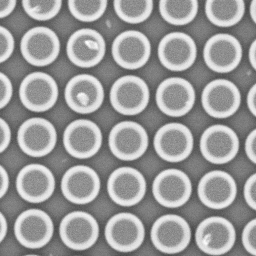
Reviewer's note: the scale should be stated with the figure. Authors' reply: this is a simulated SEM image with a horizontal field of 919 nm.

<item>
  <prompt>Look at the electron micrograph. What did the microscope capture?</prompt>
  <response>an array of small figures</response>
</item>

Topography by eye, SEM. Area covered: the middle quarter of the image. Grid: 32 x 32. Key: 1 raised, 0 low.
00001110000000111110000001111110
00000000000000000000000000011100
00000000000000000000000000000000
00111111000000111110000000000000
01111111100001111111000001111110
01111111100011111111100011111111
11111111110011111111100111111111
11111111110011111111100111111111
11111111110011111111100111111111
01111111100011111111100111111111
01111111100011111111000011111111
00111111000001111111000011111110
00000000000000011100000000111100
00000000000000000000000000000000
00111110000000011000000000000000
01111111000001111110000001111100
11111111100011111111000011111110
11111111100011111111100111111111
11111111100111111111100111111111
11111111100111111111100111111111
11111111100111111111100111111111
01111111000011111111000111111111
00111111000011111111000011111110
00001000000000111100000001111100
00000000000000000000000000000000
00010000000000000000000000000000
01111110000001111100000000110000
11111111000011111110000011111100
11111111100111111111000111111110
11111111100111111111001111111110
11111111100111111111001111111111
11111111100111111111001111111111